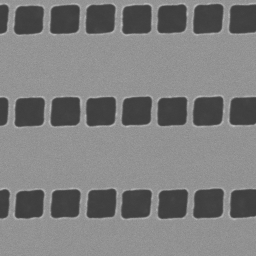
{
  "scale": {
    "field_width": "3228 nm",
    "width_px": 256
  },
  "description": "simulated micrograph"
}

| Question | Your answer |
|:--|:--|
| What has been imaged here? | a regular array of holes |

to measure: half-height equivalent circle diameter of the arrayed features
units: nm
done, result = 405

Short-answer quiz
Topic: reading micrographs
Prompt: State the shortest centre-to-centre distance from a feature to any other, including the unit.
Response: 450 nanometres